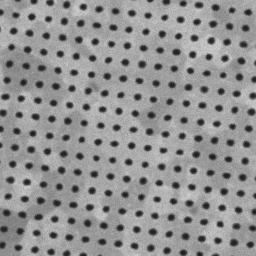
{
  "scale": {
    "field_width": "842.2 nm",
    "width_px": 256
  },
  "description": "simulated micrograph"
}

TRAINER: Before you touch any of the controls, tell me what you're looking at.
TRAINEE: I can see a regular array of holes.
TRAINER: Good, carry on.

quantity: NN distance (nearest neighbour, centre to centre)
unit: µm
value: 0.0528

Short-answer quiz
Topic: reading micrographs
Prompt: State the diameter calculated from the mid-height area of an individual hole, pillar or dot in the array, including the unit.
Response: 24.3 nanometres